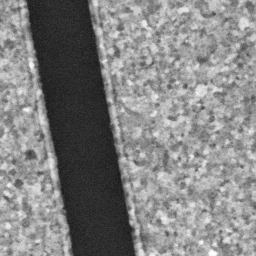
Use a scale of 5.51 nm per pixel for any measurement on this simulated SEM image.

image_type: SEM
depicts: one or a few lines or trenches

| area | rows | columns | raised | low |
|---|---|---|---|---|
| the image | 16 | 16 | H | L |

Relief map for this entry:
HLLLLLHHHHHHHHHH
HHLLLLHHHHHHHHHH
HHLLLLHHHHHHHHHH
HHLLLLLHHHHHHHHH
HHLLLLLHHHHHHHHH
HHLLLLLHHHHHHHHH
HHLLLLLHHHHHHHHH
HHHLLLLHHHHHHHHH
HHHLLLLHHHHHHHHH
HHHLLLLLHHHHHHHH
HHHLLLLLHHHHHHHH
HHHLLLLLHHHHHHHH
HHHHLLLLHHHHHHHH
HHHHLLLLHHHHHHHH
HHHHLLLLLHHHHHHH
HHHHLLLLLHHHHHHH